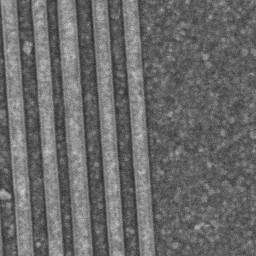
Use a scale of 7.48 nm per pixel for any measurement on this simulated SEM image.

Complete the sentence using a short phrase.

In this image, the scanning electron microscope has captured parallel lines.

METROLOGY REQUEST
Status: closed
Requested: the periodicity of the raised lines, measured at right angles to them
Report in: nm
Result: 227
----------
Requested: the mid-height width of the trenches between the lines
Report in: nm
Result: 122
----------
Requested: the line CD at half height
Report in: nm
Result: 108